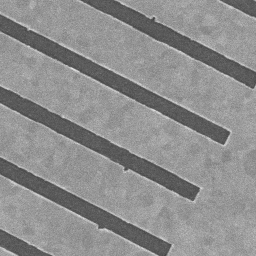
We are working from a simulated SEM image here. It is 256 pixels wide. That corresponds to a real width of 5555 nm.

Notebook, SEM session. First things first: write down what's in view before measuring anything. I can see one or a few lines or trenches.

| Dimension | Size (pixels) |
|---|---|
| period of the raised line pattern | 63.8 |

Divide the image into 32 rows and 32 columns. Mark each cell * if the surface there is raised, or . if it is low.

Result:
***********....*************....
*************....*************..
..*************.....************
....*************....***********
*.....*************....*********
***.....*************....*******
*****.....************.....*****
*******....*************.....***
*********....**************....*
***********....*************....
*************....*************..
..*************....*************
....*************....***********
*.....*************....*********
***.....*************....*******
*****.....*************....*****
*******.....************.....***
*********....*************..****
***********....*****************
*************....***************
..*************....*************
....*************....***********
*.....*************....*********
***.....*************....*******
*****.....*************..*******
*******.....********************
*********.....******************
***********....*****************
************......**************
..*************....*************
....*************....***********
*.....*************..***********